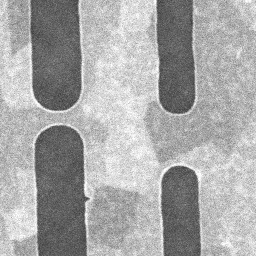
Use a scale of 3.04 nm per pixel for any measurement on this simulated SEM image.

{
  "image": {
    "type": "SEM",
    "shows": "one or a few lines or trenches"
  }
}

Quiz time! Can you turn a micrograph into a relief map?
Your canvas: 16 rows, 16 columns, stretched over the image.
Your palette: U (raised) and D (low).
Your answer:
UUDDDUUUUUDDUUUU
UUDDDUUUUUDDUUUU
UUDDDUUUUUDDUUUU
UUDDDUUUUUDDUUUU
UUDDDUUUUUDDUUUU
UUDDDUUUUUDDUUUU
UUDDDUUUUUDDUUUU
UUUUUUUUUUUUUUUU
UUDDDUUUUUUUUUUU
UUDDDUUUUUUUUUUU
UUDDDUUUUUUDUUUU
UUDDDUUUUUDDUUUU
UUDDDUUUUUDDUUUU
UUDDDUUUUUDDDUUU
UUDDDUUUUUDDDUUU
UUDDDUUUUUDDDUUU